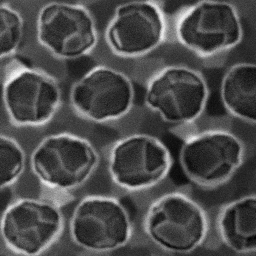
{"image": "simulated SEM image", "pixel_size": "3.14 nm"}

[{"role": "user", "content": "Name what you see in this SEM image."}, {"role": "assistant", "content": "a regular array of holes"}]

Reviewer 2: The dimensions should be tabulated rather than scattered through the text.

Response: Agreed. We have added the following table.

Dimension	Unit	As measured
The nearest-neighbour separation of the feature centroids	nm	223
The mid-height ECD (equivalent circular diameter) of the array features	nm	167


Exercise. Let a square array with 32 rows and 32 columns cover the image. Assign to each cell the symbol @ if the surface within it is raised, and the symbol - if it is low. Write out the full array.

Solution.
@@@@@@@@@@@@@@@@--@@@@@@@---@@@@
--@@@------@@@@-----@@@@-----@@@
--@@@------@@@------@@@------@@@
--@@@-------@@------@@--------@@
--@@@-------@@------@@@-------@@
--@@@@------@@------@@@------@@@
-@@@@@@---@@@@@---@@@@@@@-@@@@@@
@@@@@@@@@@@@@@@@@@@@@@@@@@@@@@@@
@@@@@@@@@@@@@@@@@@@@@@@@@@@@@---
@@---@@@@@@----@@@@@-----@@@----
@------@@@------@@@------@@@----
@------@@-------@@@-------@@----
@------@@-------@@-------@@@----
@------@@@------@@@@-----@@@@---
@@----@@@@@---@@@@@@@---@@@@@@--
@@@@@@@@@@@@@@@@@@@@@@@@@@@@@@@@
@@@@@@@@@@@@@@@@@@@@@@@@@@@@@@@@
-@@@@@----@@@@@@---@@@@@-----@@@
--@@@------@@@@-----@@@-------@@
---@--------@@-------@@-------@@
---@--------@@-------@@-------@@
--@@@------@@@-------@@------@@@
-@@@@@----@@@@@-----@@@@@---@@@@
@@@@@@@@@@@@@@@@@@@@@@@@@@@@@@@@
@@@@@@@@@@@@@@@@@@@@@-@@@@@@@@@@
@@---@@@@@-----@@@@@----@@@@@---
@------@@@-----@@@@------@@@----
-------@@-------@@@------@@@----
-------@@-------@@@------@@@----
@------@@-------@@@-@@@--@@@----
@-----@@@@-----@@@@@@@@--@@@@---
@@@--@@@@@@@@@@@@@@@@@@@@@@@@@@@